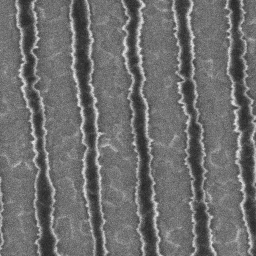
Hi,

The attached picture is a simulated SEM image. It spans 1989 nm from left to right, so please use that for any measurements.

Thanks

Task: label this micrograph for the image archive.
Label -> parallel lines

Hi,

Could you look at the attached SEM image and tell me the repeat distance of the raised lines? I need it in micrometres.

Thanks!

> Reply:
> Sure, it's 0.401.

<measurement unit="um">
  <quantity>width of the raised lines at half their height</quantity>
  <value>0.118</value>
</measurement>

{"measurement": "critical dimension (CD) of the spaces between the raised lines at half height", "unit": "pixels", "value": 35.7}